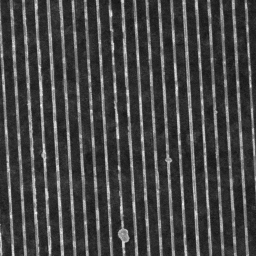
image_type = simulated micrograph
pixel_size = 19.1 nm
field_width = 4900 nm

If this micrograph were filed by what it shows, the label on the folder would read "parallel lines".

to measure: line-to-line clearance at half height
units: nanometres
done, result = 191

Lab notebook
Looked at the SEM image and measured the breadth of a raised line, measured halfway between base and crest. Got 45.4 nanometres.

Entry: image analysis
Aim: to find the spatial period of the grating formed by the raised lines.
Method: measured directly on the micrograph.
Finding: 236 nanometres